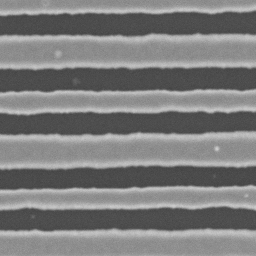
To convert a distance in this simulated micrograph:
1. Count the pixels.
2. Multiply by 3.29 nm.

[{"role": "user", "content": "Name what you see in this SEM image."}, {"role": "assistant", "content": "lines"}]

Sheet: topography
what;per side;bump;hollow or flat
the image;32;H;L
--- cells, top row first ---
HHHHHHHHHHHHHHHHHHHHHHHHHHHHHHHH
HHHHHHHHHHHHHHHHHHHHHHLLLHHHLLLL
LLLLLLLLLLLLLLLLLLLLLLLLLLLLLLLL
LLLLLLLLLLLLLLLLLLLLLLLLLLLLLLLL
HHHLHHHHHHHHLLHLLLHHHHHHHHHHHHHH
HHHHHHHHHHHHHHHHHHHHHHHHHHHHHHHH
HHHHHHHHHHHHHHHHHHHHHHHHHHHHHHHH
HHHHHHHHHHHHHHHHHHHHHHHHHHHHHHHH
HHHHHHHHHHLLHHHLHHLLHLLHLLLLLLLL
LLLLLLLLLLLLLLLLLLLLLLLLLLLLLLLL
LLLLLLLLLLLLLLLLLLLLLLLLLLLLLLLL
LHHHHHHHHHHHHHHHHHHHHHHHHHHHHHHH
HHHHHHHHHHHHHHHHHHHHHHHHHHHHHHHH
HHHHHHHHHHHHHHHHHHHHHHHHHHHHHHHH
LLLLLLLLLLLLLLLLLLLLLLLLLLLLLLLL
LLLLLLLLLLLLLLLLLLLLLLLLLLLLLLLL
LLLLLLLLLLLLLLLLLLLLLLLLLLLLLHHH
HHHHHHHHHHHHHHHHHHHHHHHHHHHHHHHH
HHHHHHHHHHHHHHHHHHHHHHHHHHHHHHHH
HHHHHHHHHHHHHHHHHHHHHHHHHHHHHHHH
HHHHHHHHHHHHHHHHHHHHHHHHHHHHHHHH
LLLLLLLLLLLLLLLLLLLLLLLLLLLLLLLL
LLLLLLLLLLLLLLLLLLLLLLLLLLLLLLLL
LLLLLLLLLLLLLLLLLLHHHHHHHHHHHHHH
HHHHHHHHHHHHHHHHHHHHHHHHHHHHHHHH
HHHHHHHHHHHHHHHHHHHHHHHHHHHHHHHH
LLLLLLLLLLLLLLLLLLLLLLLLLLLLLLLL
LLLLLLLLLLLLLLLLLLLLLLLLLLLLLLLL
LLLLLLLLLLLLLLLLLLLLLLLLLLLLLLLL
HHHHHHHHHHHHHHHHHHHHHHHHHHHHHHHH
HHHHHHHHHHHHHHHHHHHHHHHHHHHHHHHH
HHHHHHHHHHHHHHHHHHHHHHHHHHHHHHHH